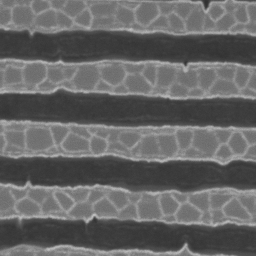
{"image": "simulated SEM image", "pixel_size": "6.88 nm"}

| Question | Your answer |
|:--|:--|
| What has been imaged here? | one or a few lines or trenches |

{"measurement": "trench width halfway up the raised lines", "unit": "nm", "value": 193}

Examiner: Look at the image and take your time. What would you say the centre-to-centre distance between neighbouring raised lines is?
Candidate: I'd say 434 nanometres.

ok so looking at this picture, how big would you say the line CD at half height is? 244 nm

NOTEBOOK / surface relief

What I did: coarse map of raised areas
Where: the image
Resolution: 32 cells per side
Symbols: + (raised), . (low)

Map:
+++++++++++++++++++++++++.++++++
++++++++++++++++++++++++++++++++
++++++++++++++++++++++++++++++++
++++++++++++++++++++++++++++++++
.....................++.+.......
................................
................................
+++++.......++++..+.............
++++++++++++++++++++++++++++++++
++++++++++++++++++++++++++++++++
++++++++++++++++++++++++++++++++
+++++++.++++++++++++++++++++++++
................................
................................
................................
++++++++++++....................
++++++++++++++++++++++++++++++++
++++++++++++++++++++++++++++++++
++++++++++++++++++++++++++++++++
++++++++++++++++++++++++++++++++
................................
................................
................................
++++++++++++++++.........+++++..
++++++++++++++++++++++++++++++++
++++++++++++++++++++++++++++++++
++++++++++++++++++++++++++++++++
+.+....++++.++.+++++++++++++++++
..........................+.....
................................
................................
+++++++++++++++++++++++++.......